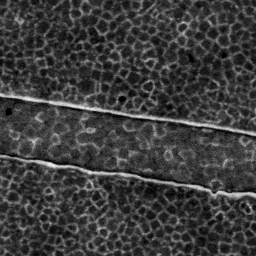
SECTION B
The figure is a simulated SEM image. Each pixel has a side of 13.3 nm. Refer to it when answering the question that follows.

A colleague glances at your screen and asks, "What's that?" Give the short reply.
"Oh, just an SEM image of one or a few lines or trenches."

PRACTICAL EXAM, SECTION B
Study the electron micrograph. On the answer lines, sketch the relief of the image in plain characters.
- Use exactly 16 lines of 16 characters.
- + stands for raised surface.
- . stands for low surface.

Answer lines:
++++++++++++++++
++++++++++++++++
++++++++++++++++
++++++++++++++++
++++++++++++++++
++++++++++++++++
....++++++++++++
...........+++++
................
................
+++++...........
+++++++++++.....
++++++++++++++++
++++++++++++++++
++++++++++++++++
++++++++++++++++